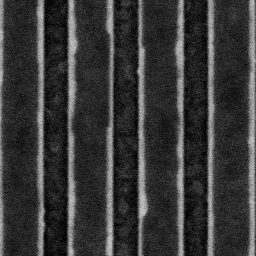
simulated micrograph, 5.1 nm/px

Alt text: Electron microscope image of one or a few lines or trenches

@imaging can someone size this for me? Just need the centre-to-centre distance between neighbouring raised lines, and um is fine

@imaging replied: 0.359